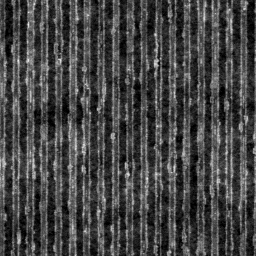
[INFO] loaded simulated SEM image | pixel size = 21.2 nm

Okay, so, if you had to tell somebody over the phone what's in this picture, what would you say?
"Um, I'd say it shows parallel lines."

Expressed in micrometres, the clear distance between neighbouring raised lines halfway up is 0.101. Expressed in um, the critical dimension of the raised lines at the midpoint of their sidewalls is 0.202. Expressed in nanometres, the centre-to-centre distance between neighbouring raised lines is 302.